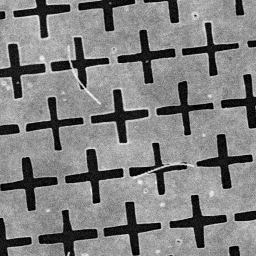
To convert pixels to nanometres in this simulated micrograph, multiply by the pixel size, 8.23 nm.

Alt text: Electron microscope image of an array of small figures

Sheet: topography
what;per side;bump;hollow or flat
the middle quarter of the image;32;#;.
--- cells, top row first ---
........###########...##########
..#...##############..##########
###...##############..##########
####..##############..##########
####..##############..#######..#
####..######################...#
############..##############...#
############...##############..#
############...##############..#
############...##############..#
############...###########......
############.........##.........
#########............##........#
.....##..............#########.#
.....##.........##############.#
...##########...##############..
#############...##############..
#############...##############..
#############...################
##############..################
######################..########
#####...##############..########
#####...##############..########
#####...##############..########
######..##############...#######
######...############..........#
######.........#..............##
##.............#....###..#######
...............########..#######
.........##############..#######
#######..##############..#######
#######..###########.##..#######